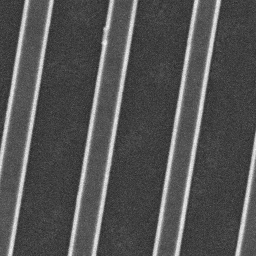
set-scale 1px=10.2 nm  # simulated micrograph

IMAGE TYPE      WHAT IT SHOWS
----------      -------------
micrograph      one or a few lines or trenches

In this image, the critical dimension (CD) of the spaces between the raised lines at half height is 600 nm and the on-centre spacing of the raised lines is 846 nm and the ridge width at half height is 249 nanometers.